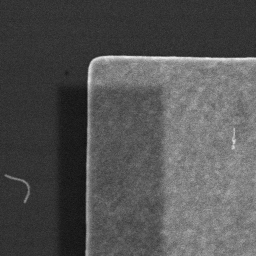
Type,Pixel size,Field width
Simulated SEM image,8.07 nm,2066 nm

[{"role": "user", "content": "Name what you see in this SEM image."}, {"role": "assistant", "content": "wiring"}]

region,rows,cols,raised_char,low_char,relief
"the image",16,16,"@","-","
----------------
----------------
----------------
----------------
------@@@@@@@@@@
------@@@@@@@@@@
------@@@@@@@@@@
------@@@@@@@@@@
-----@@@@@@@@@@@
-----@@@@@@@@@@@
-----@@@@@@@@@@@
-----@@@@@@@@@@@
-----@@@@@@@@@@@
-----@@@@@@@@@@@
-----@@@@@@@@@@@
-----@@@@@@@@@@@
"